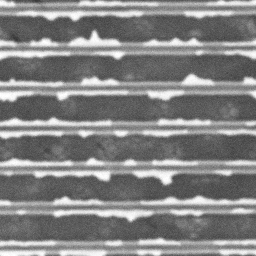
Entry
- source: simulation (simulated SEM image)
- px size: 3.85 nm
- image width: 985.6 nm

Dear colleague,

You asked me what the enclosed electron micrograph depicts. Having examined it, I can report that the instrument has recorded parallel lines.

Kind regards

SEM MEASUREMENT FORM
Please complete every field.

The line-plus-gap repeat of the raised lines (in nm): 153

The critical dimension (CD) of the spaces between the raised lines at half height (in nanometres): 102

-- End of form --